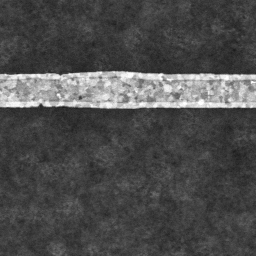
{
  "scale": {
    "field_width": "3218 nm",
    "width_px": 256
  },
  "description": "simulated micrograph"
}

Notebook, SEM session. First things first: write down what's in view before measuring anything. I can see one or a few lines or trenches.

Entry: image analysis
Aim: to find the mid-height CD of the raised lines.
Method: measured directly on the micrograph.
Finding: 351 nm